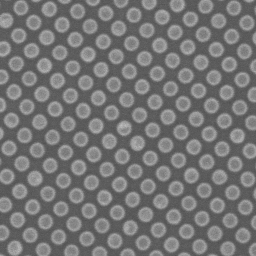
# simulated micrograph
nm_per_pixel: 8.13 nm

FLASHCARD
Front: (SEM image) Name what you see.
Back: a regular array of raised bodies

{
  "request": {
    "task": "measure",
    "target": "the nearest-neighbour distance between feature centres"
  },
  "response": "0.16 µm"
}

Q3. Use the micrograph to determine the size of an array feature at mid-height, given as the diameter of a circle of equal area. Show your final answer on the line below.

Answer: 114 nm